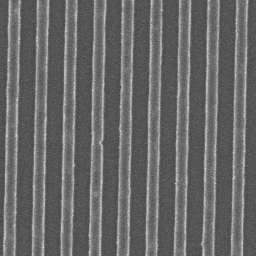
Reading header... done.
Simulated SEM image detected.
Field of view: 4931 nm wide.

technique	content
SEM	parallel lines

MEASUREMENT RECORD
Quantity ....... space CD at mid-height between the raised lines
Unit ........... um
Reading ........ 0.335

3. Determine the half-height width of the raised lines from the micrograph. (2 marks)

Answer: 205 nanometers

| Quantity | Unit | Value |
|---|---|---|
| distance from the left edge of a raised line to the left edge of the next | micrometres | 0.547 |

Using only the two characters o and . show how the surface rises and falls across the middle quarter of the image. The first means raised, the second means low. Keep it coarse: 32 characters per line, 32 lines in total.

ooo....ooo....ooo.....oo.....oo.
ooo....ooo....ooo.....oo.....oo.
ooo....ooo....ooo.....oo.....oo.
ooo....ooo....ooo.....oo.....oo.
ooo....ooo....ooo.....oo.....oo.
ooo....ooo.....oo.....oo.....oo.
ooo....ooo....ooo.....oo.....oo.
ooo....ooo....ooo.....oo.....oo.
ooo....ooo....ooo.....oo....ooo.
ooo....ooo....ooo....ooo....ooo.
ooo....ooo....ooo....ooo....ooo.
ooo....ooo....ooo....ooo....ooo.
ooo....ooo....ooo....ooo....ooo.
ooo....ooo....ooo....ooo....ooo.
ooo....ooo....ooo....ooo....ooo.
ooo....ooo....ooo....ooo....ooo.
ooo....ooo....ooo....ooo....ooo.
oo.....oo.....oo.....ooo....ooo.
oo.....oo.....oo.....ooo....ooo.
oo.....oo.....oo.....ooo....ooo.
oo.....oo.....oo.....ooo....ooo.
oo.....oo.....ooo....ooo....ooo.
oo.....oo.....ooo....ooo....ooo.
oo.....ooo....oo.....ooo....ooo.
oo.....ooo....oo.....ooo....ooo.
ooo....oo.....oo.....ooo....ooo.
oo.....oo.....oo.....ooo....ooo.
oo.....oo.....oo.....ooo....ooo.
oo.....ooo....oo.....ooo....ooo.
oo.....oo.....oo.....oo.....ooo.
oo.....oo.....oo.....oo.....oo..
oo.....oo.....oo.....oo.....oo..